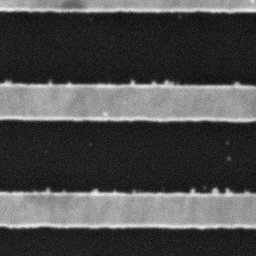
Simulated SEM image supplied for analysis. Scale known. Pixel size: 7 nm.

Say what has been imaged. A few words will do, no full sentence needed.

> lines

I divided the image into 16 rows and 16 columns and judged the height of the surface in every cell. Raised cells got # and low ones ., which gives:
################
................
................
................
................
################
################
........########
................
................
................
................
################
################
................
................